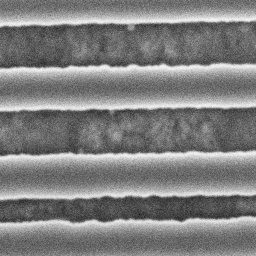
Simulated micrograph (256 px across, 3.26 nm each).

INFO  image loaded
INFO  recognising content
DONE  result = lines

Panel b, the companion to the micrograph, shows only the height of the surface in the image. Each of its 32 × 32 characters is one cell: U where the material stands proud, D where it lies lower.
UUUUUUUUUUUUUUUUUUUUUUUUUUUUUUUU
UUUUUUUUUUUUUUUUUUUUUUUUUUUUUUUU
UUUUUUUUUUUUUUUUUUUUUUUUUUUUUUUU
DDDDDDDDDDDDDDDDDDDDDDDDDDDDDDDD
DDDDDDDDDDDDDDDDDDDDDDDDDDDDDDDD
DDDDDDDDDDDDDDDDDDDDDDDDDDDDDDDD
DDDDDDDDDDDDDDDDDDDDDDDDDDDDDDDD
DDDDDDDDDDDDDDDDDDDDDDDDDDDDDDDD
DDDDDDDDUUUUUUDUUUUUUUUUUUUUUUUU
UUUUUUUUUUUUUUUUUUUUUUUUUUUUUUUU
UUUUUUUUUUUUUUUUUUUUUUUUUUUUUUUU
UUUUUUUUUUUUUUUUUUUUUUUUUUUUUUUU
UUUUUUUUUUUUUUUUUUUUUUUUUUUUUUUU
UUUUUUUUUUUUUUUUUDDDDDDDDDDDDDDD
DDDDDDDDDDDDDDDDDDDDDDDDDDDDDDDD
DDDDDDDDDDDDDDDDDDDDDDDDDDDDDDDD
DDDDDDDDDDDDDDDDDDDDDDDDDDDDDDDD
DDDDDDDDDDDDDDDDDDDDDDDDDDDDDDDD
DDDDDDDDDDDDDDDDDDDDDDDDDDDDDDDD
DUUUDUUUUUUUUUUUUUUUUUUUUUUUUUUU
UUUUUUUUUUUUUUUUUUUUUUUUUUUUUUUU
UUUUUUUUUUUUUUUUUUUUUUUUUUUUUUUU
UUUUUUUUUUUUUUUUUUUUUUUUUUUUUUUU
UUUUUUUUUUUUUUUUUUUUUUUUUUUUUUUU
UUUUUUUUUUUUUDUUDUUDUDUUDDDDDDDD
DDDDDDDDDDDDDDDDDDDDDDDDDDDDDDDD
DDDDDDDDDDDDDDDDDDDDDDDDDDDDDDDD
DDDDDDDDDDDDDDDDDDDDDDDUUUUUUUUU
UUUUUUUUUUUUUUUUUUUUUUUUUUUUUUUU
UUUUUUUUUUUUUUUUUUUUUUUUUUUUUUUU
UUUUUUUUUUUUUUUUUUUUUUUUUUUUUUUU
UUUUUUUUUUUUUUUUUUUUUUUUUUUUUUUU